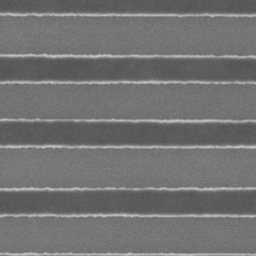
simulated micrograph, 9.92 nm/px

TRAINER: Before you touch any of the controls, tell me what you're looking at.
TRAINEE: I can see lines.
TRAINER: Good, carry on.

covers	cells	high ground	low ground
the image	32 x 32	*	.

********************************
********************************
................................
................................
................................
................................
................................
********************************
********************************
********************************
................................
................................
................................
................................
................................
********************************
********************************
********************************
................................
................................
................................
................................
................................
................................
********************************
********************************
********************************
................................
................................
................................
................................
................................